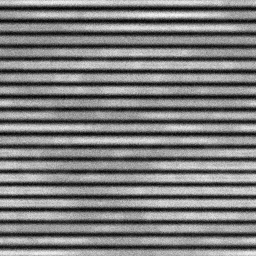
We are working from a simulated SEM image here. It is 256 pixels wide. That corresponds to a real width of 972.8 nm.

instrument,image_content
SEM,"parallel lines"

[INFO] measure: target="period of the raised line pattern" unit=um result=0.0478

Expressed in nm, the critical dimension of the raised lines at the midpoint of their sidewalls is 29.5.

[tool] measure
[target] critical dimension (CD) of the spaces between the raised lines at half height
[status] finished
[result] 18.5 nm